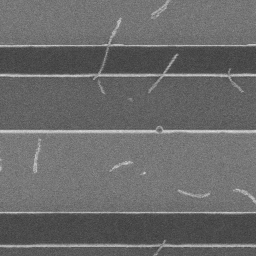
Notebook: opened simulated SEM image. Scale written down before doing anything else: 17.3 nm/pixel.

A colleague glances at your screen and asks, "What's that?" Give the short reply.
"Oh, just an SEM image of lines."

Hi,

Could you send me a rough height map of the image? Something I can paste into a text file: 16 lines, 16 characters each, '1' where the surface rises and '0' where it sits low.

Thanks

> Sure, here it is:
1111111111111111
1111111111111111
1111111111111111
1111111111111111
1111111111111111
0000000000000000
0000000000000000
0000000000000000
1111111111111111
1111111111111111
1111111111111111
1111111111111111
1111111111111111
1111111111111111
1111111111111111
0000000000000000